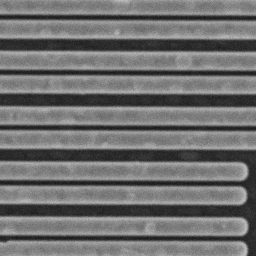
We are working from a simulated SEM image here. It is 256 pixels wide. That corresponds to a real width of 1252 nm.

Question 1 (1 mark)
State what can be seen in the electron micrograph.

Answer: parallel lines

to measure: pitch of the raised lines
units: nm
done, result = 137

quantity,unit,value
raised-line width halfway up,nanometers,87.5